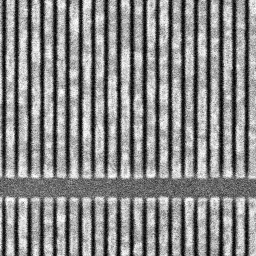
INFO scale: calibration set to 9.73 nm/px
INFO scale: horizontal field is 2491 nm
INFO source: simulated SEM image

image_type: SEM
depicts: parallel lines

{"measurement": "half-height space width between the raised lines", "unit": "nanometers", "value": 43.8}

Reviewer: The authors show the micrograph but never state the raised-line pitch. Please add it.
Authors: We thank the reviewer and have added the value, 124 nm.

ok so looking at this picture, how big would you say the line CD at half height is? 77.9 nanometers